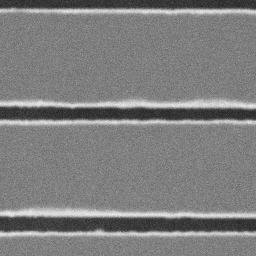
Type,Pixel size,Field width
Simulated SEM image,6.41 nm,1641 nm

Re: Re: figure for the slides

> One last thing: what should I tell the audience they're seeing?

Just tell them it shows lines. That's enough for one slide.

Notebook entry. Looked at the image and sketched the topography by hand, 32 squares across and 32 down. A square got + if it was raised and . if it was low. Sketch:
................................
++++++++++++++++++++++++++++++++
++++++++++++++++++++++++++++++++
++++++++++++++++++++++++++++++++
++++++++++++++++++++++++++++++++
++++++++++++++++++++++++++++++++
++++++++++++++++++++++++++++++++
++++++++++++++++++++++++++++++++
++++++++++++++++++++++++++++++++
++++++++++++++++++++++++++++++++
++++++++++++++++++++++++++++++++
++++++++++++++++++++++++++++++++
++++++++++++++++++++++++++++++++
................................
................................
++++++++++++++++++++++++++++++++
++++++++++++++++++++++++++++++++
++++++++++++++++++++++++++++++++
++++++++++++++++++++++++++++++++
++++++++++++++++++++++++++++++++
++++++++++++++++++++++++++++++++
++++++++++++++++++++++++++++++++
++++++++++++++++++++++++++++++++
++++++++++++++++++++++++++++++++
++++++++++++++++++++++++++++++++
++++++++++++++++++++++++++++++++
++++++++++++++++++++++++++++++++
................................
................................
++++++++++++++++++++++++++++++++
++++++++++++++++++++++++++++++++
++++++++++++++++++++++++++++++++